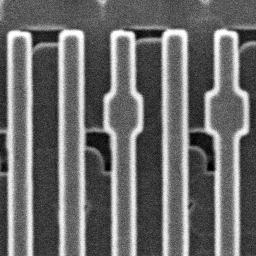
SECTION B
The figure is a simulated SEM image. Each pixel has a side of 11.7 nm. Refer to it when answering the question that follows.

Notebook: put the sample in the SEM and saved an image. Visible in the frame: wiring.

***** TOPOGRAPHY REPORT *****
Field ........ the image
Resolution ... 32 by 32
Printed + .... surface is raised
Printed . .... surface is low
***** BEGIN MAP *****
................................
................................
................................
................................
.++.....++....++.....++....++...
.+++....++....+++...+++....+++..
.+++....++....+++...+++....+++..
.+++....++....+++...+++....+++..
.+++....++....+++....++....+++..
.+++....++....+++....++....+++..
.+++....++....+++....++....+++..
.+++....++....+++....++....+++..
.+++....++...+++++...++...+++++.
.+++....++...+++++...++...+++++.
.+++....++...+++++...++...+++++.
.+++....++...+++++...++...+++++.
.+++....++....+++....++...++++..
.+++....++....+++....++....+++..
.+++....++....+++....++....+++..
.+++....++....+++....++....+++..
.+++....++....+++....++....+++..
.+++....++....+++....++....+++..
.+++....++....+++....++....+++..
.+++....++....+++....++....+++..
.+++....++....+++....++....+++..
.+++....++....+++....++....+++..
.+++....++....+++....++....+++..
.+++....++....+++....++....+++..
.+++....++....+++....++....+++..
.+++....++....+++....++....+++..
.+++....++....+++....++....+++..
.+++....++....+++....++....+++..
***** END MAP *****